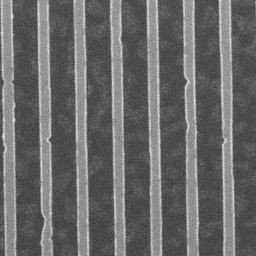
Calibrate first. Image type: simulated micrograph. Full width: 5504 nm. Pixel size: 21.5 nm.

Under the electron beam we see parallel lines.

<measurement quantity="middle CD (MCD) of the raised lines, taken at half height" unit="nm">218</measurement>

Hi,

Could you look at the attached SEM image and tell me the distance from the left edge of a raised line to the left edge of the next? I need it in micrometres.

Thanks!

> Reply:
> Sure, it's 0.783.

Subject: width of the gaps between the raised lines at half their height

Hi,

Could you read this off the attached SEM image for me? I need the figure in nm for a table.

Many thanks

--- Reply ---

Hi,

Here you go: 559